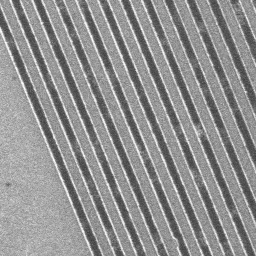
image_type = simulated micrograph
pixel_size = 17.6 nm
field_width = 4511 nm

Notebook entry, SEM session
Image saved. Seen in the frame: parallel lines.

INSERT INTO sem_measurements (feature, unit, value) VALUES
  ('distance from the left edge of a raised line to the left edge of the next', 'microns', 0.357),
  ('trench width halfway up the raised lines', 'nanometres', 187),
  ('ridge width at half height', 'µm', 0.171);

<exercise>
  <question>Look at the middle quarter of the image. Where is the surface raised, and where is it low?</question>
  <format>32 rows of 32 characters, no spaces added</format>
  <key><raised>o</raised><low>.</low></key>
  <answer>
o...ooo...oo...ooo...oo...ooo...
oo...oo...ooo...oo...ooo...oo...
oo...ooo...oo...ooo...oo...ooo..
ooo..ooo...ooo..ooo...ooo..ooo..
ooo...oo...ooo...oo...ooo...oo..
.oo...ooo...oo...ooo...oo...ooo.
.ooo...oo...ooo...oo...ooo...oo.
..oo...ooo...oo...ooo...oo...ooo
..ooo...oo...ooo...oo...ooo..ooo
..ooo...ooo..ooo...oo...ooo...oo
...oo...ooo...oo...ooo...oo...oo
...ooo...oo...ooo...oo...ooo...o
o...oo...ooo...oo...ooo...oo...o
o...ooo...oo...ooo...oo...ooo...
oo...oo...ooo..ooo...ooo..ooo...
oo...oo...ooo...oo...ooo...oo...
oo...ooo...oo...ooo...oo...ooo..
ooo...oo...ooo...oo...ooo...oo..
.oo...ooo...oo...ooo...oo...ooo.
.ooo...oo...ooo...oo...ooo..ooo.
.ooo...ooo..ooo...oo...ooo...oo.
..oo...ooo...oo...ooo...oo...ooo
..ooo...oo...ooo...oo...ooo...oo
...oo...ooo...oo...ooo...oo...oo
...ooo...oo...ooo...oo...ooo...o
o...oo...ooo..ooo...ooo..ooo...o
o...oo...ooo...oo...ooo...oo...o
o...ooo...oo...ooo...oo...ooo...
oo...oo...ooo...oo...ooo...oo...
oo...ooo...oo...ooo...oo...ooo..
ooo...oo...ooo...oo...ooo...oo..
ooo...ooo..ooo...ooo..ooo...oo..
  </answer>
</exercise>